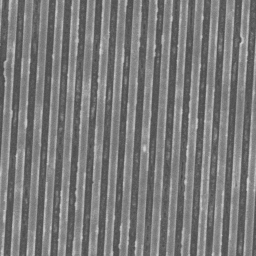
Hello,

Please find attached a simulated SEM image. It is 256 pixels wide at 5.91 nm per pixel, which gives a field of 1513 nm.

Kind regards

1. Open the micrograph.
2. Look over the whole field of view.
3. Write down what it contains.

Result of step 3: parallel lines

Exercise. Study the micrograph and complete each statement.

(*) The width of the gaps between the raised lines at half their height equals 44.3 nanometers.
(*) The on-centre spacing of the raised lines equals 91.5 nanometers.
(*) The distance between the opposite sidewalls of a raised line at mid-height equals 8.36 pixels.